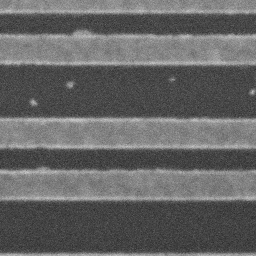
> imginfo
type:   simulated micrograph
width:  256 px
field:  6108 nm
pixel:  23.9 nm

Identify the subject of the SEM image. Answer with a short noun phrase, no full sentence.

lines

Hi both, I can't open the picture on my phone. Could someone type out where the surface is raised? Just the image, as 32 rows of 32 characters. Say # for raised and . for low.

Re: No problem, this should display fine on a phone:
################################
################################
................................
................................
#..###...#....#.#.#.............
################################
################################
################################
................................
................................
................................
................................
................................
................................
................................
################################
################################
################################
................................
................................
................................
#.##############################
################################
################################
################################
................................
................................
................................
................................
................................
................................
................................